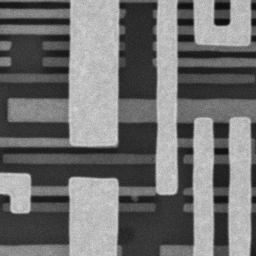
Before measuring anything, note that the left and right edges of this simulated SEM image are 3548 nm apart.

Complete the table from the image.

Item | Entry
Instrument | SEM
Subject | wiring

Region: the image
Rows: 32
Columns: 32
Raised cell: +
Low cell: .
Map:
.........++++++.....++..+++..++.
.........++++++.....++..+++..++.
.........++++++.....++..+++..++.
.........++++++.....++..+++++++.
.........++++++.....++..+++++++.
.........++++++.....++...++++++.
.........++++++.....++..........
.........++++++.....++..........
.........++++++.....++..........
.........++++++.....++..........
.........++++++.....++..........
.........++++++.....++..........
.........++++++.....++..........
.........++++++.....++..........
.........++++++.....++..........
.........++++++.....++..+++..++.
.........++++++.....++..+++..++.
.........++++++.....++..+++..++.
....................++..+++..++.
....................++..+++..++.
....................++..+++..++.
....................++..+++..++.
++++.....+++++......++..+++..++.
++++.....++++++.....++..+++..++.
.+++.....++++++.........+++..++.
.+++.....++++++.........+++..++.
..+......++++++.........+++..++.
.........++++++.........+++..++.
.........++++++.........+++..++.
.........++++++.........+++..++.
.........++++++.........+++..++.
.........++++++.........+++..++.